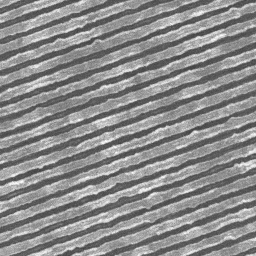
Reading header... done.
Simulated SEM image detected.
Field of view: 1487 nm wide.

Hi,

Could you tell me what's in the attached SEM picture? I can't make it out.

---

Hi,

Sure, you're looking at parallel lines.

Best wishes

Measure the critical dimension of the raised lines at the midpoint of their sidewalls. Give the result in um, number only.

0.0486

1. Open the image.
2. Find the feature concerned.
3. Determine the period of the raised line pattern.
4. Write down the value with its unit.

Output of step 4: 86 nm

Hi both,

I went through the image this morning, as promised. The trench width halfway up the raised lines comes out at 37.6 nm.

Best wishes